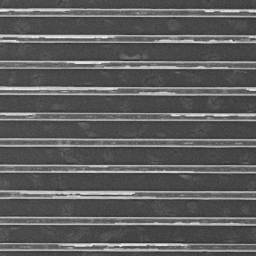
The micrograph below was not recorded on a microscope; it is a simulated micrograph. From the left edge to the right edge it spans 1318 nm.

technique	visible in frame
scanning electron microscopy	parallel lines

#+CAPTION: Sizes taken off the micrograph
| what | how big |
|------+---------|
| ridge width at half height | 36.7 nanometres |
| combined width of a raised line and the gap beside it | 134 nm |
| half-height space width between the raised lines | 95.3 nm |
